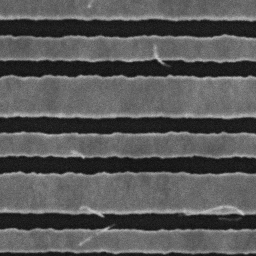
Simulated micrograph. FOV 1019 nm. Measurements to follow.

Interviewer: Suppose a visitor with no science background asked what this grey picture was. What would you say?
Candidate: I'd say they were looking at lines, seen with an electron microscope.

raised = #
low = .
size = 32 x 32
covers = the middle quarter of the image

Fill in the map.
................................
................................
................................
##.#############.###############
################################
################################
################################
################################
################################
################################
################################
################################
################################
................................
................................
................................
................................
..##........###.......#..#######
################################
################################
################################
################################
################################
..................#.....#.......
................................
................................
................................
#####...########################
################################
################################
################################
################################